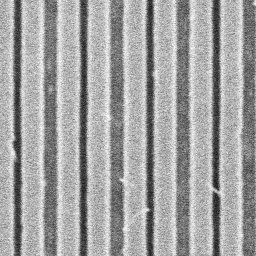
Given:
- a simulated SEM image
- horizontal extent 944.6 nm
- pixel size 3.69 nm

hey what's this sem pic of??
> parallel lines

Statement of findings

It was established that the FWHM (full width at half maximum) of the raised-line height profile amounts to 22.2 pixels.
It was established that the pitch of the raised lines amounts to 122 nanometres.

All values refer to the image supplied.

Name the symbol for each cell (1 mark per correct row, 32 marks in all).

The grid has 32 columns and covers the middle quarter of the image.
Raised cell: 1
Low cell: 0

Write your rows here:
11110011111000011111000111110000
11110011111000011111000111110000
11110011111000011111001111110000
11110011111000011111001111110000
11110011111000011111000111110000
11110011111000011111000111110000
11110011111000011111000111110000
11110011111000011111000111110000
11110011111000011111000111110000
11110011111000011111000111110000
11110011111000011111000111110000
11110011111000011111000111110000
11110011111000011111000111110000
11110011111000011111000111110000
11110011111000011111000111110000
11110011111000011111000111110000
11110011111000011111000111110000
11110011111000011111000111110000
11110011111000011111000111110000
11110011111000011111000111110000
11110011111000011111000111110000
11110011111000011111000111110000
11110011111000011111000111110000
11110011111000011111000111110000
11110011111000011111000111110000
11110011111000011111000111110000
11110011111000011111000111110000
11110011111000011111100111110000
11110011111000011111000111110000
11110011111000011111000111110000
11110011111000011111000111110000
11110011111000011111000111110000